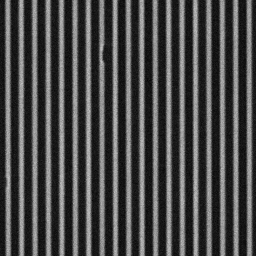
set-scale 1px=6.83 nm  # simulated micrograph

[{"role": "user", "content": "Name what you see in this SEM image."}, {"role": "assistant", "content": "parallel lines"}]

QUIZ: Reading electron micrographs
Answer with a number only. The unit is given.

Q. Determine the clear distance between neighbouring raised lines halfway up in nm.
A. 58.9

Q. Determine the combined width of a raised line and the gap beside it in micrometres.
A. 0.0916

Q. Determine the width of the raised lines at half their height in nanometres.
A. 29.9